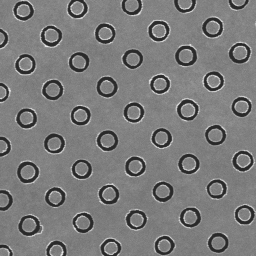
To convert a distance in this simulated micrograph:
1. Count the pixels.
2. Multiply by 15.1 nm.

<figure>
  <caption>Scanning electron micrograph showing a regular array of ring-shaped grooves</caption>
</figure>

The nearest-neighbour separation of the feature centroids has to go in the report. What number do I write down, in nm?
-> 563